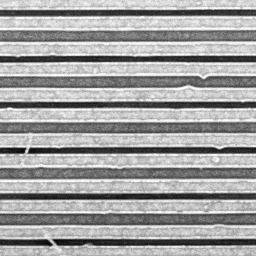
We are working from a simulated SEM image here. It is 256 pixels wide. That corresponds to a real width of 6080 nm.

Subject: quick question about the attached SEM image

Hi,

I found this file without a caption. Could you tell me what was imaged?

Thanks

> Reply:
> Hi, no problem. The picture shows parallel lines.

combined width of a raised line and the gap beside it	553	nanometres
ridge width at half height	300	nm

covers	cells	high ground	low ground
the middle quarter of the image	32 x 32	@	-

@@@@@@@@@@@@@@@@@@@@@@@@@@@@@@@@
@@@@@@@@@@@@@@@@@@@@@@@@@@@@@@@@
@@@@@@@@@@@@@@@@@@@@@@@@@@@@@@@@
--------------------------------
--------------------------------
--------------------------------
@@@@@@@@@@@@@@@@@@@@@@@@@@@@@@@@
@@@@@@@@@@@@@@@@@@@@@@@@@@@@@@@@
@@@@@@@@@@@@@@@@@@@@@@@@@@@@@@@@
--------------------------------
--------------------------------
@@@@@@@@@@@@@@@@@@@@@@@@@@@@@@@@
@@@@@@@@@@@@@@@@@@@@@@@@@@@@@@@@
@@@@@@@@@@@@@@@@@@@@@@@@@@@@@@@@
--------------------------------
--------------------------------
--------------------------------
@@@@@-----------------------@@@@
@@@@@@@@@@@@@@@@@@@@@@@@@@@@@@@@
@@@@@@@@@@@@@@@@@@@@@@@@@@@@@@@@
@@@@@@@@@@@@@@@@@@@@@@@@@@@@@@@@
--------------------------------
--------------------------------
@@@@@@@@@@@@@@@@@@@@@@@@@@@@@@@@
@@@@@@@@@@@@@@@@@@@@@@@@@@@@@@@@
@@@@@@@@@@@@@@@@@@@@@@@@@@@@@@@@
--------------------------------
--------------------------------
--------------------------------
@@@@@@@@@@@@@@@@@@@@@@@@@@@@@@@@
@@@@@@@@@@@@@@@@@@@@@@@@@@@@@@@@
@@@@@@@@@@@@@@@@@@@@@@@@@@@@@@@@